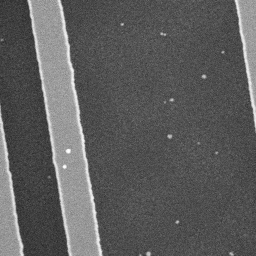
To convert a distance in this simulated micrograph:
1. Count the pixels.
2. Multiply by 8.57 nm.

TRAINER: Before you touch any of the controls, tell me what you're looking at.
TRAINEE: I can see lines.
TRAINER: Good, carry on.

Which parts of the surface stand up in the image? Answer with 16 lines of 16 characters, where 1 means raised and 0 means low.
0011000000000001
0011000000000001
0011000000000001
0011000000000001
0011100000000001
0001100000000000
0001100000000000
0001100000000000
0001100000000000
0001100000000000
1001100000000000
1000110000000000
1000110000000000
1000110000000000
1000110000000000
1000110000000000